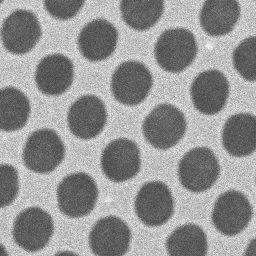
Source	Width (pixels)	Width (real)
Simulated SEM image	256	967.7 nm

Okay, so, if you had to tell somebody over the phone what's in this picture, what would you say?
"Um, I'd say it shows a regular array of holes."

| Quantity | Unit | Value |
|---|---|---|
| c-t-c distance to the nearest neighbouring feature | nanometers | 206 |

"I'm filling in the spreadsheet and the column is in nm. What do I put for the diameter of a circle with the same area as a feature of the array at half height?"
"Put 162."